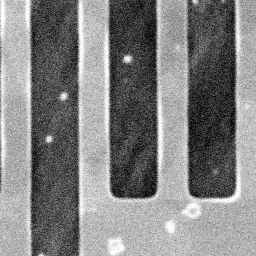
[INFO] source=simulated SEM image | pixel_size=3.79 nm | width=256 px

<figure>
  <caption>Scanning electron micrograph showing groups of lines, slits or small figures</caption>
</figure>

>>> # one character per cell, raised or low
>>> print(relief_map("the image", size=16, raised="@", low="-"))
@@---@@---@@---@
@@---@@---@@---@
@@---@@---@@---@
@@---@@---@@---@
@@---@@---@@---@
@@---@@---@@---@
@@---@@---@@---@
@@---@@---@@---@
@@---@@---@@---@
@@---@@---@@---@
@@---@@---@@---@
@@---@@---@@---@
@@---@@@@@@@@@@@
@@---@@@@@@@@@@@
@@---@@@@@@@@@@@
@@---@@@@@@@@@@@